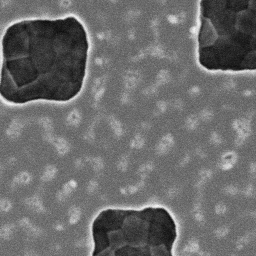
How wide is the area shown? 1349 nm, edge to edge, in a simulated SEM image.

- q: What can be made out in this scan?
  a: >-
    holes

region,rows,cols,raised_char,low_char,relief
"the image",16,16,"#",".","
############....
#....#######....
.....#######....
.....#######....
.....###########
.....###########
################
################
################
################
################
################
################
######.....#####
######.....#####
######.....#####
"